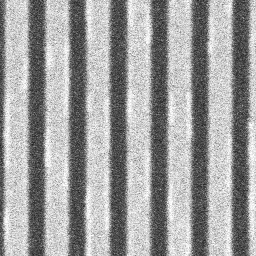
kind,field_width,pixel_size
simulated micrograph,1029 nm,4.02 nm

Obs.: parallel lines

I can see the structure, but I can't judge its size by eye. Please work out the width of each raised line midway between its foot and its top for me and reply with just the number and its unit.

0.0965 microns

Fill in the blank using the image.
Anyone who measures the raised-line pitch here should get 164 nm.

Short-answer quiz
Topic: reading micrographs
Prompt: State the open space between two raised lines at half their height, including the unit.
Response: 0.0683 µm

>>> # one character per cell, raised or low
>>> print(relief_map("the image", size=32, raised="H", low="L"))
LHHHLLHHHLLHHHLLHHHLLHHHLLHHHLLH
LHHHLLHHHLLHHHLLHHHLLHHHLLHHHLLH
LHHHLLHHHLLHHHLLHHHLLHHHLLHHHLLH
LHHHLLHHHLLHHHLLHHHLLHHHLLHHHLLH
LHHHLLHHHLLHHHLLHHHLLHHHLLHHHLLH
LHHHLLHHHLLHHHLLHHHLLHHHLLHHHLLH
LHHHLLHHHLLHHHLLHHHLLHHHLLHHHLLH
LHHHLLHHHLLHHHLLHHHLLHHHLLHHHLLH
LHHHLLHHHLLHHHLLHHHLLHHHLLHHHLLH
LHHHLLHHHLLHHHLLHHHLLHHHLLHHHLLH
LHHHLLHHHLLHHHLLHHHLLHHHLLHHHLLH
LHHLLLHHHLLHHHLLHHHLLHHHLLHHHLLH
LHHLLLHHHLLHHHLLHHHLLHHHLLHHHLLH
LHHLLLHHHLLHHHLLHHHLLHHHLLHHHLLH
LHHLLLHHHLLHHHLLHHHLLHHHLLHHHLLH
LHHLLLHHHLLHHHLLHHHLLHHHLLHHHLLH
LHHLLLHHHLLHHHLLHHHLLHHHLLHHHLLH
LHHLLLHHHLLHHHLLHHHLLHHHLLHHHLLH
LHHLLLHHHLLHHHLLHHHLLHHHLLHHHLLH
LHHLLLHHHLLHHHLLHHHLLHHHLLHHHLLH
LHHLLLHHHLLHHHLLHHHLLHHHLLHHHLLH
LHHLLLHHHLLHHHLLHHHLLHHHLLHHHLLH
LHHLLLHHHLLHHHLLHHHLLHHHLLHHHLLH
LHHLLLHHHLLHHHLLHHHLLHHHLLHHHLLH
LHHLLLHHHLLHHHLLHHHLLHHHLLHHHLLH
LHHLLLHHHLLHHHLLHHHLLHHHLLHHHLLH
LHHLLLHHHLLHHHLLHHHLLHHHLLHHHLLH
LHHLLLHHHLLHHHLLHHHLLHHHLLHHHLLH
LHHLLLHHHLLHHHLLHHHLLHHHLLHHHLLH
LHHLLLHHHLLHHHLLHHHLLHHHLLHHHLLH
LHHLLLHHHLLHHHLLHHHLLHHHLLHHHLLH
LHHLLLHHHLLHHHLLHHHLLHHHLLHHHLLH